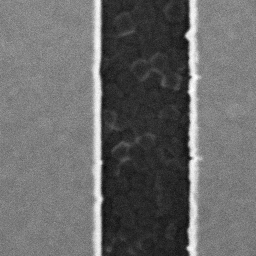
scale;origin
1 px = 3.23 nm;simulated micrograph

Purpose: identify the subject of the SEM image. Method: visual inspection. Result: one or a few lines or trenches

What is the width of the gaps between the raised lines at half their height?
304 nm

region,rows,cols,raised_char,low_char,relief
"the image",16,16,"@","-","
@@@@@@------@@@@
@@@@@@------@@@@
@@@@@@------@@@@
@@@@@@------@@@@
@@@@@@------@@@@
@@@@@@------@@@@
@@@@@@------@@@@
@@@@@@------@@@@
@@@@@@------@@@@
@@@@@@------@@@@
@@@@@@------@@@@
@@@@@@------@@@@
@@@@@@------@@@@
@@@@@@------@@@@
@@@@@@------@@@@
@@@@@@------@@@@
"